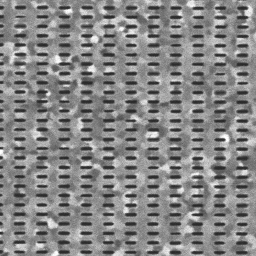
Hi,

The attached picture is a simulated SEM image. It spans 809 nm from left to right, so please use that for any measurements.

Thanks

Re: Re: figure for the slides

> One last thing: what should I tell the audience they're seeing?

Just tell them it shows a regular array of holes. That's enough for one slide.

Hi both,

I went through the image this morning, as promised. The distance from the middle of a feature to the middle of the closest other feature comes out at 9.05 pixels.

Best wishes